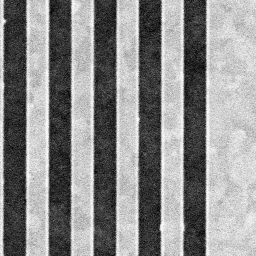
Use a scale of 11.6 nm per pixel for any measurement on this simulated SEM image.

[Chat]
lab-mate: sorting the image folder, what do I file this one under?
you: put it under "parallel lines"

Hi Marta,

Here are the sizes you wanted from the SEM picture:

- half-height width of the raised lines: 236 nanometres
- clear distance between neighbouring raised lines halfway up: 0.287 µm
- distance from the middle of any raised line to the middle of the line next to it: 523 nm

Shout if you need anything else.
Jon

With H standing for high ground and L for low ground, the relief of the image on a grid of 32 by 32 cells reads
LLLHHHLLLHHHLLLHHLLLHHHLLLHHHHHH
LLLHHHLLLHHHLLLHHLLLHHHLLLHHHHHH
LLLHHHLLLHHHLLLHHLLLHHHLLLHHHHHH
LLLHHHLLLHHHLLLHHLLLHHHLLLHHHHHH
LLLHHHLLLHHHLLLHHLLLHHHLLLHHHHHH
LLLHHHLLLHHHLLLHHLLLHHHLLLHHHHHH
LLLHHHLLLHHHLLLHHLLLHHHLLLHHHHHH
LLLHHHLLLHHHLLLHHLLLHHHLLLHHHHHH
LLLHHHLLLHHHLLLHHLLLHHHLLLHHHHHH
LLLHHHLLLHHHLLLHHLLLHHHLLLHHHHHH
LLLHHHLLLHHHLLLHHLLLHHHLLLHHHHHH
LLLHHHLLLHHHLLLHHLLLHHHLLLHHHHHH
LLLLHHLLLHHHLLLHHLLLHHHLLLHHHHHH
LLLHHHLLLHHHLLLHHLLLHHHLLLHHHHHH
LLLHHHLLLHHHLLLHHLLLHHHLLLHHHHHH
LLLHHHLLLHHHLLLHHLLLHHHLLLHHHHHH
LLLLHHLLLHHHLLLHHLLLHHHLLLHHHHHH
LLLLHHLLLHHHLLLHHLLLHHHLLLHHHHHH
LLLLHHLLLHHHLLLHHLLLHHHLLLHHHHHH
LLLLHHLLLHHHLLLHHLLLHHHLLLHHHHHH
LLLLHHLLLHHHLLLHHLLLHHHLLLHHHHHH
LLLHHHLLLHHHLLLHHLLLHHHLLLHHHHHH
LLLHHHLLLHHHLLLHHLLLHHHLLLHHHHHH
LLLHHHLLLHHHLLLHHLLLHHHLLLHHHHHH
LLLHHHLLLHHHLLLHHLLLHHHLLLHHHHHH
LLLHHHLLLHHHLLLHHLLLHHHLLLHHHHHH
LLLHHHLLLHHHLLLHHLLLHHHLLLHHHHHH
LLLHHHLLLHHHLLLHHLLLHHHLLLHHHHHH
LLLHHHLLLHHLLLLHHLLLHHHLLLHHHHHH
LLLHHHLLLHHLLLLHHLLLHHHLLLHHHHHH
LLLHHHLLLHHLLLLHHLLLHHHLLLHHHHHH
LLLHHHLLLHHLLLLHHLLLHHHLLLHHHHHH